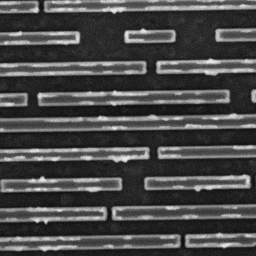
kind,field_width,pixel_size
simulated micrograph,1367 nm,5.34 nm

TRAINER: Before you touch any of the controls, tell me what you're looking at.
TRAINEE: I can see parallel lines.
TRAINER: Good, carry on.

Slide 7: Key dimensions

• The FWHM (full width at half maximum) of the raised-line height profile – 64.1 nanometres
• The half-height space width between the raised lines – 98.2 nm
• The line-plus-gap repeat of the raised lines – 156 nm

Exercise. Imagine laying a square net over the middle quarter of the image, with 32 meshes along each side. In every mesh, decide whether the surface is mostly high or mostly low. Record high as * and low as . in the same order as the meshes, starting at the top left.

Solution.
********************...*********
********************...*********
................................
................................
................................
................................
................................
********************************
********************************
********************************
................................
................................
................................
...**...***...**..**************
********************************
********************************
**..........*...................
................................
................................
................................
................................
*********************...********
*********************...********
*********************...*.......
.............*.*................
................................
................................
................................
..............................**
**************......************
**************......************
.....****.......................